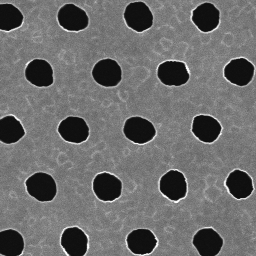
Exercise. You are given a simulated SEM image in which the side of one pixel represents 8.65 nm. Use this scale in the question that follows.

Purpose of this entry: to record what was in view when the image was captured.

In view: a regular array of holes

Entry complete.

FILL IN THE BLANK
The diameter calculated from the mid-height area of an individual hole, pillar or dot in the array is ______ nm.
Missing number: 244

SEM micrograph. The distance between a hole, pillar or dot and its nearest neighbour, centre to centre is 64.4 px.